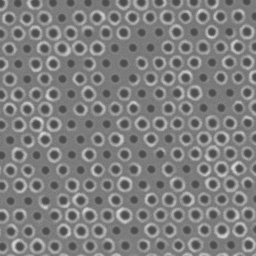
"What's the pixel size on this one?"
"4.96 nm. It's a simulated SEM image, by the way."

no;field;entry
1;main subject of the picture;a regular array of holes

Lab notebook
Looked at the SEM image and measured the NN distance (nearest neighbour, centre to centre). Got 0.086 micrometres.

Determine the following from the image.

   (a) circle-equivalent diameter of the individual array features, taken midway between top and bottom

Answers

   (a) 8.12 pixels